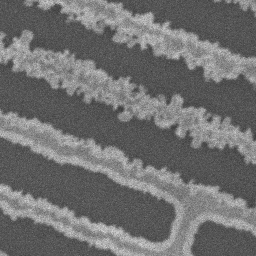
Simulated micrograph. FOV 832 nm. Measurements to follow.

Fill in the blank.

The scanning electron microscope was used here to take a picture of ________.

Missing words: one or a few lines or trenches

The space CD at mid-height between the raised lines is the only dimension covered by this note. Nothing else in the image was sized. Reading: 0.156 microns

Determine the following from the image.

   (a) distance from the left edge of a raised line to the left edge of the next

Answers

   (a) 226 nanometres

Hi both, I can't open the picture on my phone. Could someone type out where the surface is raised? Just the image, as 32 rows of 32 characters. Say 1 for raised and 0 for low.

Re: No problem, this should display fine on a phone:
00000011111111000000000000000001
00000000111111100000000000000000
00000000001111111110000000000000
00000000000000011111000000000000
00000000000000000111111100000000
00100000000000000001111110000000
11111100000000000000111111110000
00111111100000000000000111111111
00011111111000000000000000111111
00000111111110000000000000011001
00000000111111110000000000000000
00000000100111110000000000000000
00000000000000111111011000000000
00000000000000001111111000000000
10000000000000010001111110000000
11111000000000000000101111111000
11111110000000000000001011111100
00111111100000000000000011111111
00001111111100000000000000000011
00000001111111100000000000000001
00000000001111111100000000000000
00000000000001111111000000000000
00000000000000011111100000000000
00000000000000000011111111000000
11100000000000000000111111111000
11111100000000000000001111111100
01111111000000000000001111111111
00000111100000000000001110001111
00000001111110000000001100000001
00000000001111110000001100000000
00000000000011111100011100000000
00000000000000011111111000000000